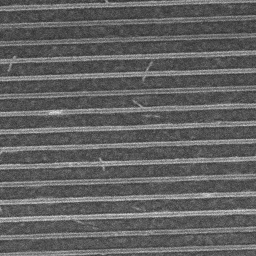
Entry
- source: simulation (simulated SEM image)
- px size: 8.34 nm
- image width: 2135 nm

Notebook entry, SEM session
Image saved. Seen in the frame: parallel lines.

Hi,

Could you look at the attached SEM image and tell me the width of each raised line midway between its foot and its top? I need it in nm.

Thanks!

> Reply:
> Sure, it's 35.4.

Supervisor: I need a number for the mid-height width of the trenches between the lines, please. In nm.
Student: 115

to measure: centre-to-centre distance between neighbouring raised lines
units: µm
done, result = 0.147